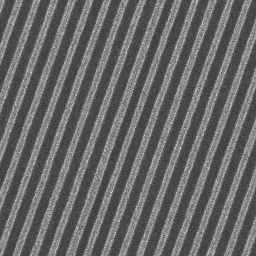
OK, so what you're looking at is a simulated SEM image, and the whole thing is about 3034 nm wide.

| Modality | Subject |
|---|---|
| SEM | parallel lines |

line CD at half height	0.0851	micrometres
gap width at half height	106	nm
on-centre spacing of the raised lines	197	nanometers